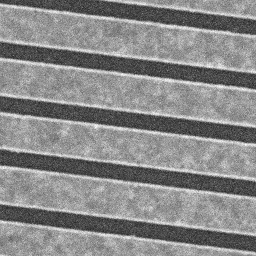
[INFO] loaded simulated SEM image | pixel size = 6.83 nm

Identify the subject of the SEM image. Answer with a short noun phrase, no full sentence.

parallel lines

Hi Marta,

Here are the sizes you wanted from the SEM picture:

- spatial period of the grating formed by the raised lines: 367 nm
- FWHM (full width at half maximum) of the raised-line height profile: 244 nm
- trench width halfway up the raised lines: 123 nanometres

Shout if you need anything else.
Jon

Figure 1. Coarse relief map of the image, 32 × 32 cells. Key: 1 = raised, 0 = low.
00000000000000000011111111111111
11111110000000000000000000111111
11111111111111110000000000000000
11111111111111111111111100000000
11111111111111111111111111111111
00001111111111111111111111111111
00000000000011111111111111111111
10000000000000000000111111111111
11111111100000000000000000001111
11111111111111111000000000000000
11111111111111111111111111000000
11111111111111111111111111111111
00000011111111111111111111111111
00000000000000111111111111111111
11000000000000000000001111111111
11111111111000000000000000000011
11111111111111111110000000000000
11111111111111111111111111000000
11111111111111111111111111111111
00000000111111111111111111111111
00000000000000001111111111111111
11111000000000000000000011111111
11111111111110000000000000000000
11111111111111111111100000000000
11111111111111111111111111111000
01111111111111111111111111111111
00000000011111111111111111111111
00000000000000000111111111111111
11111110000000000000000001111111
11111111111111100000000000000000
11111111111111111111111000000000
11111111111111111111111111111100